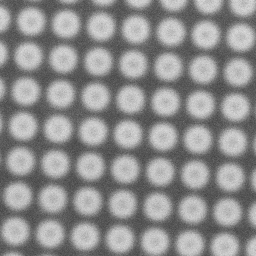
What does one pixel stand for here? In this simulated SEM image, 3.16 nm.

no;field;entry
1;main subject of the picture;an array of small figures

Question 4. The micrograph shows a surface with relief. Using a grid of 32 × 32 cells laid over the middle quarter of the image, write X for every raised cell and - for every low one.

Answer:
XXX---XXXXXX--XXXXXX---XXXXXX---
XX----XXXXX---XXXXXX---XXXXXX--X
-------XXX-----XXXXX---XXXXXX---
------------------------XXXX----
X-------------------------------
XX----XXXX----------------------
XX---XXXXXX----XXXX-----XXX-----
XXX--XXXXXX---XXXXXX---XXXXX----
XX---XXXXXX--XXXXXXX--XXXXXXX--X
XX---XXXXXX--XXXXXXX--XXXXXXX--X
X-----XXXX----XXXXX---XXXXXXX--X
---------------XXXX----XXXXX---X
------------------------XXX-----
--------------------------------
X----XXXX------XX---------------
XX--XXXXXX----XXXXX----XXXX-----
XX--XXXXXXX--XXXXXX---XXXXXX---X
XX--XXXXXXX--XXXXXX---XXXXXX---X
X---XXXXXX---XXXXXX---XXXXXX--XX
-----XXXX----XXXXXX---XXXXXX--XX
--------------XXXX----XXXXX----X
-------------------------------X
------X-------------------------
X---XXXXX-----XXX---------------
X---XXXXXX---XXXXX----XXXX------
X--XXXXXXX--XXXXXXX--XXXXXX---XX
X--XXXXXXX--XXXXXXX--XXXXXX---XX
----XXXXX---XXXXXX---XXXXXX---XX
-----XXX-----XXXXX---XXXXXX---XX
--------------XX------XXXX----XX
-------------------------------X
----XXXX------------------------